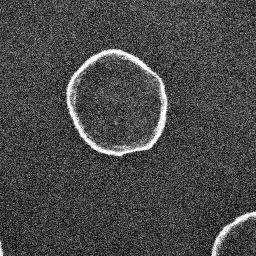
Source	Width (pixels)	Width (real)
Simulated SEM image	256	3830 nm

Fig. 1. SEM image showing raised bodies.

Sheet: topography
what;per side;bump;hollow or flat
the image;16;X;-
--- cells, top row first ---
----------------
----------------
----------------
------XX--------
-----XXXX-------
----XXXXXX------
----XXXXXX------
-----XXXXX------
-----XXXXX------
-------X--------
----------------
----------------
----------------
---------------X
--------------XX
-------------XXX